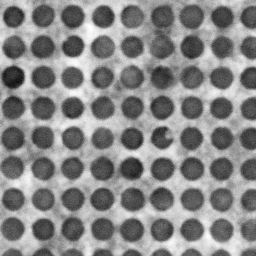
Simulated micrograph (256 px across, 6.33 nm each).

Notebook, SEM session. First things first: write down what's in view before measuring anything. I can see a regular array of holes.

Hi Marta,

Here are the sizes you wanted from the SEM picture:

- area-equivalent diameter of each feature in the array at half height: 154 nm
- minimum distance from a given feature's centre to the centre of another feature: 187 nm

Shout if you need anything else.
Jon